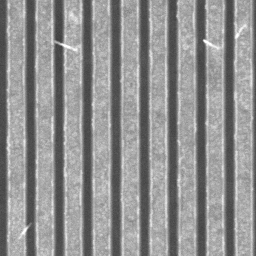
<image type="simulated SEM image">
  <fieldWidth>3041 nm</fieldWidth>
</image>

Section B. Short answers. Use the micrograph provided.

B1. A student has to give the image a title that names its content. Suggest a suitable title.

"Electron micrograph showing parallel lines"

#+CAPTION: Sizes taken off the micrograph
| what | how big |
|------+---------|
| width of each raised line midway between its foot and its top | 221 nanometres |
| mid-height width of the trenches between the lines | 122 nm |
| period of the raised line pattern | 337 nanometers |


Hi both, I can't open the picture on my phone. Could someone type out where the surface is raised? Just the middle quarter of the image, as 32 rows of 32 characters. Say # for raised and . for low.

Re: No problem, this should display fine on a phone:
####...####...#####..#####..####
####...####...#####..#####..####
####...####...#####..#####..####
####...####...#####..#####..####
####...####...#####..#####..####
####...####...#####..#####..####
####...####...#####..#####..####
####...####...#####...####..####
####...####...#####...####..####
####...####...#####...####..####
#####..####...#####...####..####
#####..####...#####...####..####
#####..####...#####...####..####
#####..####...#####...####..####
#####..####...#####...####..####
#####..####...#####...####..####
#####..####...#####...####...###
#####..#####..#####...####...###
#####..#####..#####...####...###
#####..#####..#####...####...###
#####..#####..#####...####...###
#####..#####..#####...####...###
#####..#####..#####...####...###
#####..#####..#####...####...###
#####..#####...####...####...###
#####..#####...####...####...###
#####..#####...####...####...###
#####..#####...####...####...###
#####..#####..#####...####...###
#####..#####..#####...####...###
#####..#####..#####...####...###
#####..#####..#####...####...###